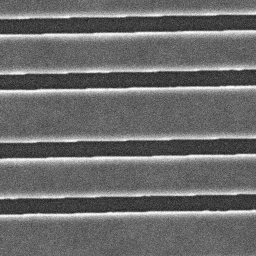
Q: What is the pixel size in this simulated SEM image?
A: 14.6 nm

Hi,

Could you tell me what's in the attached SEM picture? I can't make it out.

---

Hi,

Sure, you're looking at lines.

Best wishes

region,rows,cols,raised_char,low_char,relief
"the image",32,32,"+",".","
++++++++++++++++++++++++++++++++
++++++++++++++++++++++++++++++++
................................
................................
++++++++++++++++++++++++++++++++
++++++++++++++++++++++++++++++++
++++++++++++++++++++++++++++++++
++++++++++++++++++++++++++++++++
++++++++++++++++++++++++++++++++
................................
................................
++++++++++++++++++++++++++++++++
++++++++++++++++++++++++++++++++
++++++++++++++++++++++++++++++++
++++++++++++++++++++++++++++++++
++++++++++++++++++++++++++++++++
++++++++++++++++++++++++++++++++
++++++++++++++++................
................................
.......................+++++++++
++++++++++++++++++++++++++++++++
++++++++++++++++++++++++++++++++
++++++++++++++++++++++++++++++++
++++++++++++++++++++++++++++++++
++++++++++++....................
................................
.............................+++
++++++++++++++++++++++++++++++++
++++++++++++++++++++++++++++++++
++++++++++++++++++++++++++++++++
++++++++++++++++++++++++++++++++
++++++++++++++++++++++++++++++++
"